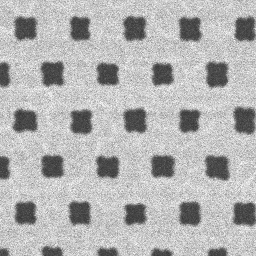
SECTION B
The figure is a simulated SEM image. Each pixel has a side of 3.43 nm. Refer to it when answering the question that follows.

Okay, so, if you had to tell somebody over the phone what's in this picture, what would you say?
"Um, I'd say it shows a regular array of holes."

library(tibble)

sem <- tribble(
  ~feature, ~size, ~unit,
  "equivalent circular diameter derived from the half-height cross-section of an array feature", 79.1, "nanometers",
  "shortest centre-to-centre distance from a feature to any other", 182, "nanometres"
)